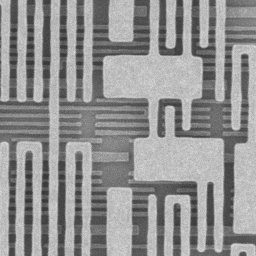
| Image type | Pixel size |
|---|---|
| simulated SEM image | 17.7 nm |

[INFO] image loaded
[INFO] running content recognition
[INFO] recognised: wiring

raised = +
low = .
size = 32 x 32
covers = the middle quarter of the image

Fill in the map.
.++..++...++++++++++++++++++++++
.++..++...++++++++++++++++++++++
.++..++...++++++++++++++++++++++
.++..++...++++++++++++++++++++++
.++..++...++++++++++++++++++++++
.++..++...++++++++++++++++++++++
.++..++...++++++++++++++++++++++
.++..++...++++++++++++++++++++++
.++..++.............+++++.++++++
.....................+++......++
.....................++.......++
.....................++..++...++
.....................++..++...++
.....................++..++...++
.....................++..++...++
.....................++..++...++
.....................++..++.....
.....................++..++.....
....................++++++++++++
..................++++++++++++++
.++++++...........++++++++++++++
.++++++...........++++++++++++++
.++..++...........++++++++++++++
.++..++...........++++++++++++++
.++..++...........++++++++++++++
.++..++...........++++++++++++++
.++..++...........++++++++++++++
.++..++...........++++++++++++++
.++..++...........++++++++++++++
.++..++.........................
.++..++.........................
.++..++....++++++...............